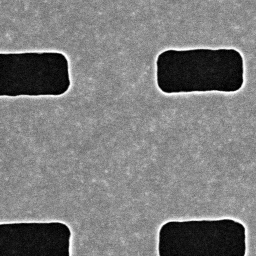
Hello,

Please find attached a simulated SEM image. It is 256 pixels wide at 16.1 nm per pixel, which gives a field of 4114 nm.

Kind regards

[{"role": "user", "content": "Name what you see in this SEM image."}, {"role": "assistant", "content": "holes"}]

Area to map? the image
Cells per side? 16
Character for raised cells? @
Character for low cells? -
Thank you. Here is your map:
@@@@@@@@@@@@@@@@
@@@@@@@@@@@@@@@@
@@@@@@@@@@@@@@@@
----@@@@@@-----@
----@@@@@@-----@
----@@@@@@-----@
@@@@@@@@@@@@@@@@
@@@@@@@@@@@@@@@@
@@@@@@@@@@@@@@@@
@@@@@@@@@@@@@@@@
@@@@@@@@@@@@@@@@
@@@@@@@@@@@@@@@@
@@@@@@@@@@@@@@@@
@@@@@@@@@@@@@@@@
----@@@@@@-----@
----@@@@@@-----@